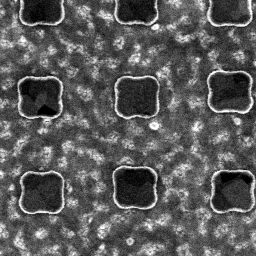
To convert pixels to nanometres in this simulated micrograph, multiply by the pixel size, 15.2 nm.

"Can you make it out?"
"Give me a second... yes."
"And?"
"raised bodies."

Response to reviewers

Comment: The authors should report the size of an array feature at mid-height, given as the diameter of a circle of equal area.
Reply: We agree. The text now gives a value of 695 nm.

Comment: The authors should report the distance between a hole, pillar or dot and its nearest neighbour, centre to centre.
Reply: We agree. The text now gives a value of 1410 nm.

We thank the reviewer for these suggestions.